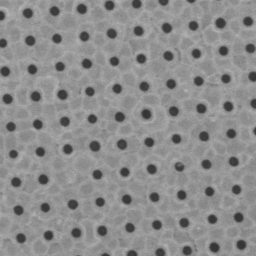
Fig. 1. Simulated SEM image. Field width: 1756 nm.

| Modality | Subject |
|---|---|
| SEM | a regular array of holes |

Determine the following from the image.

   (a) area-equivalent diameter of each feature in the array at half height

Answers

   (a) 70.9 nanometres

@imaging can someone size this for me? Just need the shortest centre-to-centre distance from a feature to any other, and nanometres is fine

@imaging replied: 185